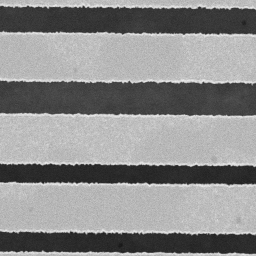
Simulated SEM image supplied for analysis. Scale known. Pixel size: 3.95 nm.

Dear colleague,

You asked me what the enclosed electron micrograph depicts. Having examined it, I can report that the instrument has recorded lines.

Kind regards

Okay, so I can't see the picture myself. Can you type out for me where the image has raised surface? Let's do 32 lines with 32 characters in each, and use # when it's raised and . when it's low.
################################
................................
................................
................................
################################
################################
################################
################################
################################
################################
................................
................................
................................
................................
############################...#
################################
################################
################################
################################
################################
...#.#.###..####################
................................
................................
################################
################################
################################
################################
################################
################################
................................
................................
##.###..........................